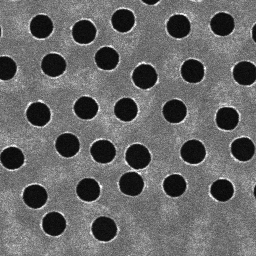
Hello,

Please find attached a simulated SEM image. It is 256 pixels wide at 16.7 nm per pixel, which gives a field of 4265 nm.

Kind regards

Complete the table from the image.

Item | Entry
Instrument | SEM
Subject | a regular array of holes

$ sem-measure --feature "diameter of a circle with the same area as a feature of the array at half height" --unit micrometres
0.403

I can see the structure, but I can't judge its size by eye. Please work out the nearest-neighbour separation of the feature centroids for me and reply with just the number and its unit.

0.639 µm